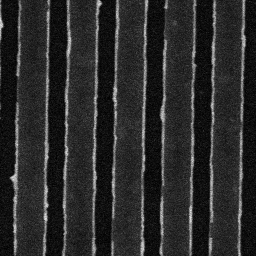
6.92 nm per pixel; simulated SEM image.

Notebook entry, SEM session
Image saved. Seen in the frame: parallel lines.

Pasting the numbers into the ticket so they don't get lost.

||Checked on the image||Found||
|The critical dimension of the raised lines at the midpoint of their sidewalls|0.221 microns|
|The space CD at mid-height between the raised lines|117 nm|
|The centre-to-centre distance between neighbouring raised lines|337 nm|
